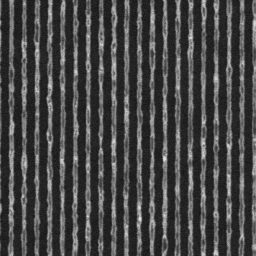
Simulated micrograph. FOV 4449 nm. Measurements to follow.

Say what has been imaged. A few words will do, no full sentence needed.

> parallel lines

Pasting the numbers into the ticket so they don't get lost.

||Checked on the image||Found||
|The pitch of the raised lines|222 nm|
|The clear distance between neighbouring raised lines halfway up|0.156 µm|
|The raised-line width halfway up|52.1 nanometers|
